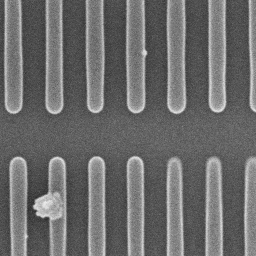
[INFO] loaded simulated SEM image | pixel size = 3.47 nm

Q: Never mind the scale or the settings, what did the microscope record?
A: groups of lines, slits or small figures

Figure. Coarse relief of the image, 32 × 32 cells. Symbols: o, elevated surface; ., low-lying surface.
.o....oo...oo...oo...oo...oo...o
.o....oo...oo...oo...oo...oo...o
.o....oo...oo...oo...oo...oo...o
.o....oo...oo...oo...oo...oo...o
.oo...oo...oo...oo...oo...oo...o
.oo...oo...oo...oo...oo...oo...o
.oo...oo...oo...oo...oo...oo...o
.oo...oo...oo...oo...oo...oo...o
.oo...oo...oo...oo...oo...oo...o
.oo...oo...oo...oo...oo...oo...o
.oo...oo...oo...oo...oo...oo...o
.oo...oo...oo...oo...oo...oo...o
.oo...oo...oo...oo...oo...oo...o
.oo...oo...oo...oo...oo...oo....
................................
................................
................................
................................
................................
................................
.oo...oo...oo...oo...o....o....o
.oo...oo...oo...oo...oo...oo...o
.oo...oo...oo...oo...oo...oo...o
.oo...oo...oo...oo...oo...oo...o
.oo...oo...oo...oo...oo...oo...o
.oo.oooo...oo...oo...oo...oo...o
.oo..ooo...oo...oo...oo...oo...o
.oo...oo...oo...oo...oo...oo...o
.oo...oo...oo...oo...oo...oo...o
.oo...oo...oo...oo...oo...oo...o
.oo...oo...oo...oo...oo...oo...o
.oo...oo...oo...oo...oo...oo...o